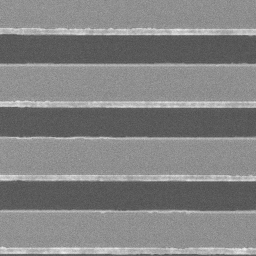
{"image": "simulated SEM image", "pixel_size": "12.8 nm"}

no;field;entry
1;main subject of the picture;lines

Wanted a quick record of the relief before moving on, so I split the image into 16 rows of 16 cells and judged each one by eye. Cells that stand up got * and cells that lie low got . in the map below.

****************
****************
................
................
****************
****************
****************
................
................
****************
****************
................
................
****************
****************
****************